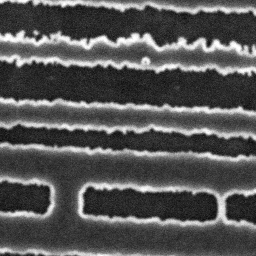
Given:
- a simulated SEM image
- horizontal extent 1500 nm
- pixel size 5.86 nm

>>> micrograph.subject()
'one or a few lines or trenches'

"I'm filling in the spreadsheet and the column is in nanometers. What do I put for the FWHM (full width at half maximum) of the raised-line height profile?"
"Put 170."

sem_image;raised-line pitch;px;59.5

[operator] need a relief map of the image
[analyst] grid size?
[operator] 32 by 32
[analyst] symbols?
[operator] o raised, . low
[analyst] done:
......oooooooooooooooooooooooooo
.......................oo...o.oo
................................
................................
ooo....o........ooo.............
oooooooooooooooooooo..oooooo.o..
oooooooooooooooooooooooooooooooo
oooooooooooooooooooooooooooooooo
..............o..ooooooooooooooo
................................
................................
................................
oo.....o........................
ooooooooooooooooooooooo.oo......
oooooooooooooooooooooooooooooooo
oooooooooooooooooooooooooooooooo
.................o...ooooooooooo
................................
ooooooooooo.....................
oooooooooooooooooooooooooooo...o
oooooooooooooooooooooooooooooooo
oooooooooooooooooooooooooooooooo
oooooooooooooooooooooooooooooooo
......ooooo.oooooooooooooooooooo
......oooo.................oo...
......oooo.................o....
..oo..oooo.................o....
oooooooooooooooooooo.o.....oo...
oooooooooooooooooooooooooooooooo
oooooooooooooooooooooooooooooooo
oooooooooooooooooooooooooooooooo
oooooooooooooooooooooooooooooooo